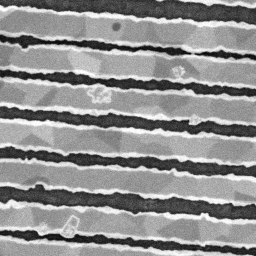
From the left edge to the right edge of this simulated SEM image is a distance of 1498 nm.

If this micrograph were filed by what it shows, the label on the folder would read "parallel lines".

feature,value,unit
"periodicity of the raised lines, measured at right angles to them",227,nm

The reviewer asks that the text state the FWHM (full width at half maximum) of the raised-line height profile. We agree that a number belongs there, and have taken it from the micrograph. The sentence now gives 150 nm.